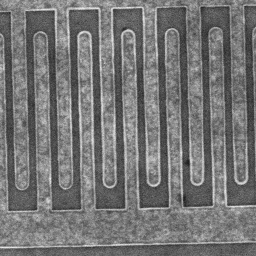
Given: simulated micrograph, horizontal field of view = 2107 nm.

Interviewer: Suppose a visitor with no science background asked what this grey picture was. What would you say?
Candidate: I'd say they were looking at groups of lines, slits or small figures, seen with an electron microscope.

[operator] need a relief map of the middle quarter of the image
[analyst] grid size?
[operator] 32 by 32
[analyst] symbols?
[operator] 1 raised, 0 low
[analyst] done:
10001110011100011100111000111001
10001110011100011100111000111001
10001110011100011100111000111001
10001110011100011100111000111001
11001110011100011100111000111001
11001110011100011100111000111001
11001110011100011100111000111001
11001110001100011100111000111001
11001110001100011100111000111001
11001110001100011100111100111001
11001110001100011100111100111001
11001110001100011100111100111001
11001110001100011100111100111001
11001110001100011100011100111001
11001110001100011100011100111001
11001110001100011100011100111001
11001110001100011100011100111001
11001110001100011100011100111000
11001110001100011100011100111000
11001110001100011100011100111000
11001110001100001100011100111000
11001110001100001100011100111000
11001110001110001100011100111000
11001110001110001100011100111000
11001110001110001100011100111000
11001110001110001100011100111000
11001110001110001100011100111000
11001110001110001100011100111000
11001110001110001100011100111000
11001110001110001100011100111000
11001110000100001100000000111000
00001110000000001100000000111000